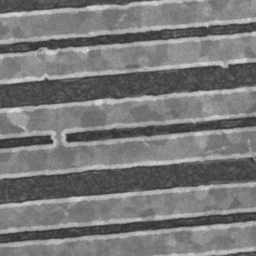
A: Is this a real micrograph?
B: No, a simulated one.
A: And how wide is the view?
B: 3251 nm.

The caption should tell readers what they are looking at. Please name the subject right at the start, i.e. parallel lines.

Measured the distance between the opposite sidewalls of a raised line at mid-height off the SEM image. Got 346 nm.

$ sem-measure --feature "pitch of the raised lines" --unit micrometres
0.601